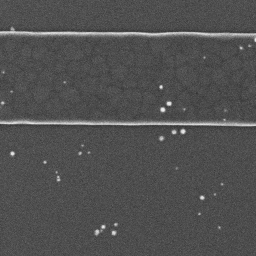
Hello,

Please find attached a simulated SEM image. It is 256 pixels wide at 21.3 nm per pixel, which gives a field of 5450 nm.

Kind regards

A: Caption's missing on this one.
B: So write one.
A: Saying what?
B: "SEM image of wiring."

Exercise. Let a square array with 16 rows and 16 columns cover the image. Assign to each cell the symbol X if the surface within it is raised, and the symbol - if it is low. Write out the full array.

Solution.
----------------
----------------
XXXXXXXXXXXXXXXX
XXXXXXXXXXXXXXXX
XXXXXXXXXXXXXXXX
XXXXXXXXXXXXXXXX
XXXXXXXXXXXXXXXX
XXXXXXXXXXXXXXXX
----------------
----------------
----------------
----------------
----------------
----------------
----------------
----------------